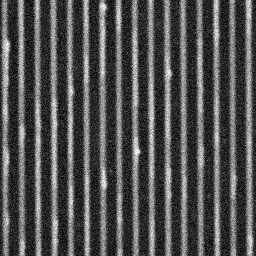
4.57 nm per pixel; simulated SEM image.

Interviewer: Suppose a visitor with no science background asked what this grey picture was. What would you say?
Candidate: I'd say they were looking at parallel lines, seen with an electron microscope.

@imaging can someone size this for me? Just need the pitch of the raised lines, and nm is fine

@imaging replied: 74.2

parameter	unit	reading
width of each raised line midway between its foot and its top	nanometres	18.3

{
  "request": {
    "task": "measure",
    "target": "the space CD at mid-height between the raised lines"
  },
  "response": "54.3 nanometres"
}